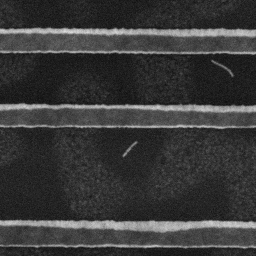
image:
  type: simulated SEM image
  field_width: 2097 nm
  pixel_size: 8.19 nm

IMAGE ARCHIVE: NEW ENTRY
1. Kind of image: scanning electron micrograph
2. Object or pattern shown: lines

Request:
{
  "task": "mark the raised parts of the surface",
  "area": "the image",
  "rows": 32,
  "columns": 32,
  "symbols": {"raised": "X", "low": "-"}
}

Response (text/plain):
--------------------------------
--------------------------------
--------------------------------
--------------------------------
XXXXXXXXXXXXXXXXXXXXXXXXXXXXXXXX
XXXXXXXXXXXXXXXXXXXXXXXXXXXXXXXX
XXXXXXXXXXXXXXXXXXXXXXXXXXXXXXXX
--------------------------------
--------------------------------
--------------------------------
--------------------------------
--------------------------------
--------------------------------
XXXXXXXXXXXXXXXXXXXXXXXXXXX-XXXX
XXXXXXXXXXXXXXXXXXXXXXXXXXXXXXXX
XXXXXXXXXXXXXXXXXXXXXXXXXXXXXXXX
--------------------------------
--------------------------------
--------------------------------
--------------------------------
--------------------------------
--------------------------------
--------------------------------
--------------------------------
--------------------------------
--------------------------------
--------------------------------
--------------------------------
XXXXXXXXXXXXXXXXXXXXXXXXXXXXXXXX
XXXXXXXXXXXXXXXXXXXXXXXXXXXXXXXX
XXXXXXXXXXXXXXXXXXXXXXXXXXXXXXXX
--------------------------------